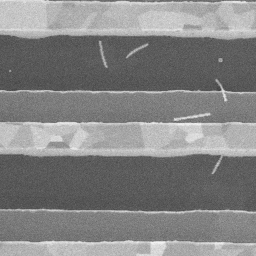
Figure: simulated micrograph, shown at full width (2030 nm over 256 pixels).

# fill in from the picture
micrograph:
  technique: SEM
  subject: lines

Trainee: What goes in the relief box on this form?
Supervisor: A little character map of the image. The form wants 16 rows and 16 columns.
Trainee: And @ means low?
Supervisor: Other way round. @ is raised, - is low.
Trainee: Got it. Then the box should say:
@@@@@@@@@@@@@@@@
@@@@@@@@@@@@@@@@
----------------
----------------
----------------
----------------
@@@@@@@@@@@@@@@@
@@@@@@@@@@@@@@@@
@@@@@@@@@@@@@@@@
----------------
----------------
----------------
----------------
@@@@@@@@@@@@@@@@
@@@@@@@@@@@@@@@@
@@@@@@@@@@@@@@@@